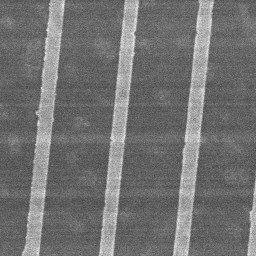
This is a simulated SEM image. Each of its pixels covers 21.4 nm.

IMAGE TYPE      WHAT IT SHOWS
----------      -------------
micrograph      one or a few lines or trenches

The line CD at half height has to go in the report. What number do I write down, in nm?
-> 280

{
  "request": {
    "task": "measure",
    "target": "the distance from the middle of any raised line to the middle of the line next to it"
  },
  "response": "1590 nanometres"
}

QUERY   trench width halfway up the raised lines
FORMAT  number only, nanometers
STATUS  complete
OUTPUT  1300